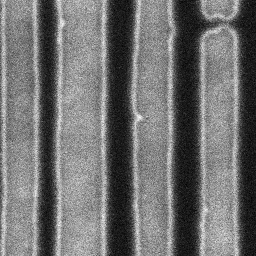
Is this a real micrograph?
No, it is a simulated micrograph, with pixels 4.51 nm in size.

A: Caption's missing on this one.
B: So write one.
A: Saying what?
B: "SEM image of one or a few lines or trenches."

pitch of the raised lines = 0.314 um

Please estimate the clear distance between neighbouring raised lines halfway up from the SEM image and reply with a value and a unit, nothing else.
141 nm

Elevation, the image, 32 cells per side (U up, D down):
UDDDUUUDDDDDDUUUUUDDDUUUUDDDDUUU
UDDDUUUUDDDDDUUUUDDDDUUUUUDDDUUU
UDDDUUUUDDDDDUUUUDDDDUUUUUUUUUUU
DDDDUUUUDDDDDUUUUDDDDUUUUUUUUUUU
UDDDUUUUDDDDDUUUUDDDDUUUUUDDDUUU
UDDDUUUUDDDDDUUUUDDDDUUUUDDDDUUU
UDDDUUUUDDDDDUUUUDDDDUUUUDDDDUUU
UDDDUUUUDDDDDUUUUDDDDUUUUDDDDUUU
UDDDUUUUDDDDDUUUUDDDDUUUUDDDDUUU
UDDDDUUUDDDDDUUUUDDDDUUUUDDDDUUU
DDDDDUUUDDDDDUUUUDDDDUUUUDDDDUUU
DDDDDUUUDDDDDUUUUDDDDUUUUDDDDUUU
DDDDUUUUDDDDDUUUUDDDDUUUUDDDDUUU
UDDDUUUUDDDDDUUUUDDDDUUUUDDDDUUU
UDDDUUUUDDDDDUUUUDDDDUUUUDDDDUUU
UDDDDUUUDDDDDUUUUDDDDUUUUDDDDUUU
UDDDDUUDDDDDDUUUUDDDDUUUUDDDDUUU
UDDDUUUDDDDDDUUUUDDDDUUUUDDDDUUU
UDDDUUUDDDDDDUUUUDDDDUUUUDDDDUUU
UDDDDUUDDDDDDUUUUDDDDUUUUDDDDUUU
UDDDDUUDDDDDDUUUUDDDDUUUUUDDDUUU
UDDDDUUDDDDDDUUUUDDDDUUUUUDDDUUU
UDDDDUUDDDDDDUUUUDDDDUUUUUDDDUUU
UDDDUUUUDDDDDUUUUDDDDUUUUUDDDUUU
UDDDUUUUDDDDDUUUUDDDDUUUUUDDDUUU
UDDDUUUUDDDDDUUUUDDDDUUUUUDDDUUU
UDDDUUUDDDDDDUUUUDDDDUUUUUDDDUUU
UDDDUUUDDDDDDUUUUDDDDUUUUUDDDUUU
UDDDUUUDDDDDDUUUUDDDDUUUUUDDDUUU
UDDDUUUDDDDDDUUUUDDDDUUUUDDDDUUU
DDDDUUUDDDDDDUUUUDDDDUUUUDDDDUUU
DDDDUUUDDDDDDUUUUDDDDUUUUDDDDUUU